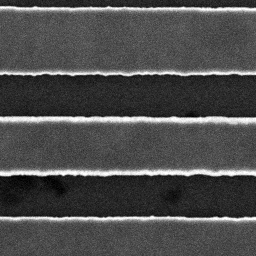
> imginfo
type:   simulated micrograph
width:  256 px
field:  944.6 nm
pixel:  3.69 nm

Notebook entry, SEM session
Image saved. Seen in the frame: lines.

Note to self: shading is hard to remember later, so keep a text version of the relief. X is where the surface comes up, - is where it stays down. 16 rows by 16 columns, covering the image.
XXXXXXXXXXXXX-X-
XXXXXXXXXXXXXXXX
XXXXXXXXXXXXXXXX
XXXXXXXXXXXXXXXX
XXXXXXXXXXXXXXXX
----------------
----------------
XXXXXXXXXXXXXXXX
XXXXXXXXXXXXXXXX
XXXXXXXXXXXXXXXX
XXXXXXXXXXXXXXXX
----------------
----------------
----------------
XXXXXXXXXXXXXXXX
XXXXXXXXXXXXXXXX